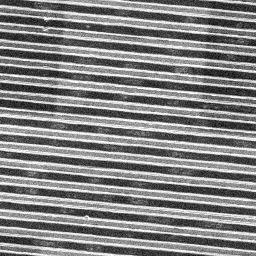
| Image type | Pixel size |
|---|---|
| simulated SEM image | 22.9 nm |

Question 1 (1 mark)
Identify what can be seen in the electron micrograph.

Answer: parallel lines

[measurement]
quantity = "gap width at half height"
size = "157 nm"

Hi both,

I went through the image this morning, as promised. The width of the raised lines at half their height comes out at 0.223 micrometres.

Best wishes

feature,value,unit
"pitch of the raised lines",387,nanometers